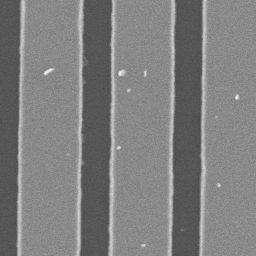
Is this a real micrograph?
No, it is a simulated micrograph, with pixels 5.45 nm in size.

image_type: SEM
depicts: lines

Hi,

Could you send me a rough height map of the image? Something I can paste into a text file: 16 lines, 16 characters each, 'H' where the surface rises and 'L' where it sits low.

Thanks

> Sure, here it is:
LHHHHLLHHHHLLHHH
LHHHHLLHHHHLLHHH
LHHHHLLHHHHLLHHH
LHHHHLLHHHHLLHHH
LHHHHLLHHHHLLHHH
LHHHHLLHHHHLLHHH
LHHHHLLHHHHLLHHH
LHHHHLLHHHHLLHHH
LHHHHLLHHHHLLHHH
LHHHHLLHHHHLLHHH
LHHHHLLHHHHLLHHH
LHHHHLLHHHHLLHHH
LHHHHLLHHHHLLHHH
LHHHHLLHHHHLLHHH
LHHHHLLHHHHLLHHH
LHHHHLLHHHHLHHHH